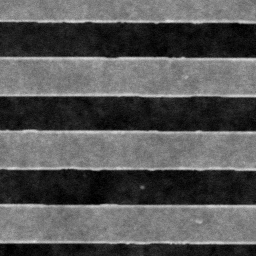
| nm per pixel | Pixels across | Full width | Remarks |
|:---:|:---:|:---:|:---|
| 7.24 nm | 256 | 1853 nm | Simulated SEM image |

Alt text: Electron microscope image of lines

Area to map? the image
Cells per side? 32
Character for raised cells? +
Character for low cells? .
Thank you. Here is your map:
++++++++++++++++++++++++++++++++
++++++++++++++++++++++++++++++++
++++++++++++++++++++++++++++++++
................................
................................
................................
................................
++++++++++++++++++++++++++++++++
++++++++++++++++++++++++++++++++
++++++++++++++++++++++++++++++++
++++++++++++++++++++++++++++++++
++++++++++++++++++++++++++++++++
................................
................................
................................
................................
++++++++++++++++................
++++++++++++++++++++++++++++++++
++++++++++++++++++++++++++++++++
++++++++++++++++++++++++++++++++
++++++++++++++++++++++++++++++++
................................
................................
................................
................................
................................
++++++++++++++++++++++++++++++++
++++++++++++++++++++++++++++++++
++++++++++++++++++++++++++++++++
++++++++++++++++++++++++++++++++
................................
................................